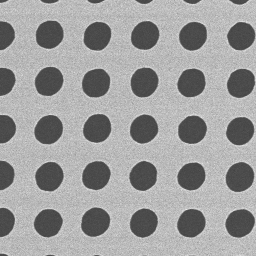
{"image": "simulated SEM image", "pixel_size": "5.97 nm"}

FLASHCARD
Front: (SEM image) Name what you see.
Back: a regular array of holes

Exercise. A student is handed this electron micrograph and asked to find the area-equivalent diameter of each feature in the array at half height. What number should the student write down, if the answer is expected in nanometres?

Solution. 170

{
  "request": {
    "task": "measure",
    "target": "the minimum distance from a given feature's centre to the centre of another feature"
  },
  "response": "279 nanometers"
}